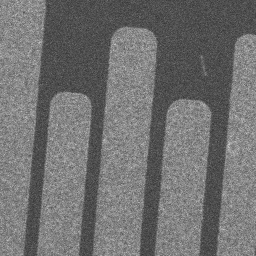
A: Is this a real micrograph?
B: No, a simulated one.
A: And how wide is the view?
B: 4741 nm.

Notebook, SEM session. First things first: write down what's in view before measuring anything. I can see parallel lines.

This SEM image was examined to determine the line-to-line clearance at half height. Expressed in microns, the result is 0.3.